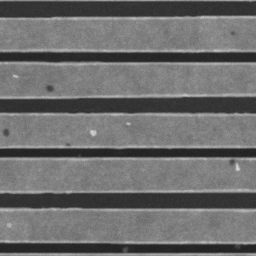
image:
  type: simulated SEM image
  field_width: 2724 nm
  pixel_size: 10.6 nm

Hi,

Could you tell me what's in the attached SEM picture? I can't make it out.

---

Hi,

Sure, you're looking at lines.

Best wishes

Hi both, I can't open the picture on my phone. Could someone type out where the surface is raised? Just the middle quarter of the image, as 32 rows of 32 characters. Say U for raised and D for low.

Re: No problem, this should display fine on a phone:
UUUUUUUUUUUUUUUUUUUUUUUUUUUUUUUU
UUUUUUUUUUUUUUUUUUUUUUUUUUUUUUUU
UUUUUUUUUUUUUUUUUUUUUUUUUUUUUUUU
UUUUUUUUUUUUUUUUUUUUUUUUUUUUUUUU
UUUUUUUUUUUUUUUUUUUUUUUUUUUUUUUU
UUUUUUUUUUUUUUUUUUUUUUUUUUUUUUUU
UUUUUUUUUUUUUUUUUUUUUUUUUUUUUUUU
UUUUUUUUUUUUUUUUUUUUUUUUUUUUUUUU
UDDDDDDDDDDDDDDDDDDDDDDDDDDDDDDD
DDDDDDDDDDDDDDDDDDDDDDDDDDDDDDDD
DDDDDDDDDDDDDDDDDDDDDDDDDDDDDDDD
DDDDDDDDDDDDDDDDDDDDDDDDDDDDDDDD
UDDDUDDDDUUUUUUDDDDUUUUUUUUUDDDD
UUUUUUUUUUUUUUUUUUUUUUUUUUUUUUUU
UUUUUUUUUUUUUUUUUUUUUUUUUUUUUUUU
UUUUUUUUUUUUUUUUUUUUUUUUUUUUUUUU
UUUUUUUUUUUUUUUUUUUUUUUUUUUUUUUU
UUUUUUUUUUUUUUUUUUUUUUUUUUUUUUUU
UUUUUUUUUUUUUUUUUUUUUUUUUUUUUUUU
UUUUUUUUUUUUUUUUUUUUUUUUUUUUUUUU
UUUUUUUUUUUUUUUUUUUUUUUUUUUUUUUU
DDDDDDDDDDDDDDDDDDDDDDDDDDDDDDDD
DDDDDDDDDDDDDDDDDDDDDDDDDDDDDDDD
UUUUUUUUUUUUUUUUUUUUUUUUUUUUUUUU
UUUUUUUUUUUUUUUUUUUUUUUUUUUUUUUU
UUUUUUUUUUUUUUUUUUUUUUUUUUUUUUUU
UUUUUUUUUUUUUUUUUUUUUUUUUUUUUUUU
UUUUUUUUUUUUUUUUUUUUUUUUUUUUUUUU
UUUUUUUUUUUUUUUUUUUUUUUUUUUUUUUU
UUUUUUUUUUUUUUUUUUUUUUUUUUUUUUUU
UUUUUUUUUUUUUUUUUUUUUUUUUUUUUUUU
UUUUUUUUUUUUUUUUUUUUUUUUUUUUUUUU